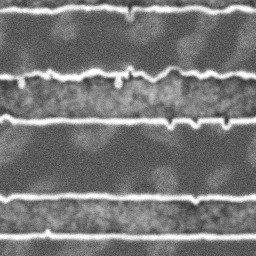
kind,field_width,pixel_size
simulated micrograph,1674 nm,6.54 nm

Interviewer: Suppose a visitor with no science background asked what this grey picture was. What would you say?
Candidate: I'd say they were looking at one or a few lines or trenches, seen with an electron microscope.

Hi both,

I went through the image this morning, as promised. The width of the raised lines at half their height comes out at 490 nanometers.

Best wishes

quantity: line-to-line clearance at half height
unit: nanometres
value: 256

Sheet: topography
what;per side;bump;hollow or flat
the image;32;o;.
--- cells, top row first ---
................................
oooooooooooooooooooooooooooooooo
oooooooooooooooooooooooooooooooo
oooooooooooooooooooooooooooooooo
oooooooooooooooooooooooooooooooo
oooooooooooooooooooooooooooooooo
oooooooooooooooooooooooooooooooo
oooooooooooooooooooooooooooooooo
oooooooooooooooooooooooooooooooo
ooo....oooo...oo..oo.....o.oo..o
..o...........o.................
................................
................................
................................
................................
oooooooooooooooooooooooooooo.ooo
oooooooooooooooooooooooooooooooo
oooooooooooooooooooooooooooooooo
oooooooooooooooooooooooooooooooo
oooooooooooooooooooooooooooooooo
oooooooooooooooooooooooooooooooo
oooooooooooooooooooooooooooooooo
oooooooooooooooooooooooooooooooo
oooooooooooooooooooooooooooooooo
oooooooo.ooo.ooooooooooooooooooo
................................
................................
................................
................................
...oooo.o................o......
oooooooooooooooooooooooooooooooo
oooooooooooooooooooooooooooooooo